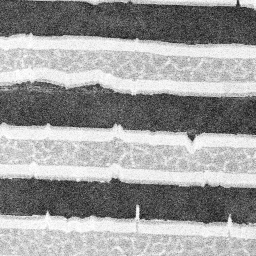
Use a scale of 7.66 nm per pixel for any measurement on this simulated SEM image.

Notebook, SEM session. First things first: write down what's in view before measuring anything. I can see one or a few lines or trenches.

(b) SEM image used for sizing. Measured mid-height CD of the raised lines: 37.1 px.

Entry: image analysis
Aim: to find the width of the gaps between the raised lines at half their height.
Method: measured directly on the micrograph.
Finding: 401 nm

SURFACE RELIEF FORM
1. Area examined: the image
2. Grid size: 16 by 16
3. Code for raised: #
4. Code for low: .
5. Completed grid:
................
................
................
################
################
.............###
................
................
########........
################
################
................
................
................
###############.
################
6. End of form